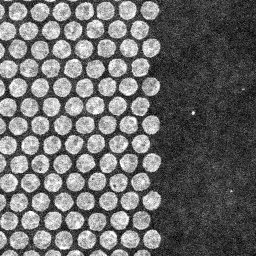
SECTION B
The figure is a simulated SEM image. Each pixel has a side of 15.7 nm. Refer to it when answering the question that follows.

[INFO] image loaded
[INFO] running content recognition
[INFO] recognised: a regular array of raised bodies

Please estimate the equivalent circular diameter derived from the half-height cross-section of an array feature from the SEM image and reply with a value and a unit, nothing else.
274 nanometres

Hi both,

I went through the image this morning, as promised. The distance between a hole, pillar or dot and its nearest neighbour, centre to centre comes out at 336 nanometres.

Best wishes